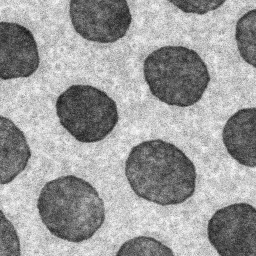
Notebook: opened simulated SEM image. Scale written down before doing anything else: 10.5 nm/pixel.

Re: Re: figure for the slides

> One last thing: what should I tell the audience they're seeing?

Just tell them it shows holes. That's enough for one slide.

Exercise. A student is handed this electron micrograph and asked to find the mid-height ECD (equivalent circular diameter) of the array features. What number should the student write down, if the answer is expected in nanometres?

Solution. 679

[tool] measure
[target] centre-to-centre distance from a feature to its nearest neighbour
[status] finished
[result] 1000 nanometers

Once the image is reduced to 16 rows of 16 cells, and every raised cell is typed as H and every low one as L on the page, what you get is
HHHHLLLLHHHLLLHH
LHHHHLLLHHHHHHHL
LLHHHHLHHHHHHHHL
LLHHHHHHHLLLHHHL
LLHHHHHHHLLLLHHH
HHHHLLHHHLLLLHHH
HHHHLLLHHHHLHHHH
LHHHLLLHHHHHHHLL
LLHHHLLHHHHHHHLL
LLHHHHHHLLLHHHLL
LLHHHHHHLLLLHHHH
HHHLLLHHLLLLHHHH
HHLLLLHHHLLLHHHH
HHHLLLLHHHHHHLLL
LHHLLLHHHHHHHLLL
LHHHHHHLLLLHHLLL